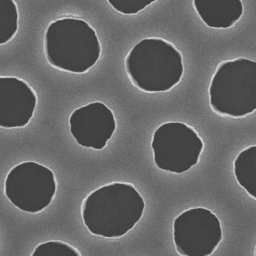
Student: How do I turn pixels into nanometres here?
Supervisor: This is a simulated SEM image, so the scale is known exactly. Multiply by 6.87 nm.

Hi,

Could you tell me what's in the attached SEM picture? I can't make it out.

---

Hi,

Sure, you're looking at holes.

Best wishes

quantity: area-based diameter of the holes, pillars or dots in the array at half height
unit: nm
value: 353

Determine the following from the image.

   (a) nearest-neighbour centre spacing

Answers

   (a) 582 nanometres